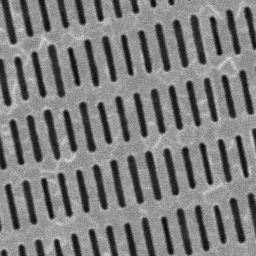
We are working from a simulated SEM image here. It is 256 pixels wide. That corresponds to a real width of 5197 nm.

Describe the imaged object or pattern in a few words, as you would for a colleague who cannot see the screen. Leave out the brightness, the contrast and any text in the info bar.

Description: a regular array of holes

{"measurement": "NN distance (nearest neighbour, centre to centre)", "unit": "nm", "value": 364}